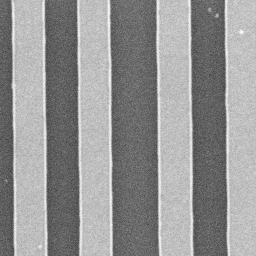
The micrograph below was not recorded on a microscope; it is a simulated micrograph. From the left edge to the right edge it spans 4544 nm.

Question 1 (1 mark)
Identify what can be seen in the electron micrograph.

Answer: groups of lines, slits or small figures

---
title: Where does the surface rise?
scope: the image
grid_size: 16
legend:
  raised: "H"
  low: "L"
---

LHHLLHHLLLHHLLHH
LHHLLHHLLLHHLLHH
LHHLLHHLLLHHLLHH
LHHLLHHLLLHHLLHH
LHHLLHHLLLHHLLHH
LHHLLHHLLLHHLLHH
LHHLLHHLLLHHLLHH
LHHLLHHLLLHHLLHH
LHHLLHHLLLHHLLHH
LHHLLHHLLLHHLLHH
LHHLLHHLLLHHLLHH
LHHLLHHLLLHHLLHH
LHHLLHHLLLHHLLHH
LHHLLHHLLLHHLLHH
LHHLLHHLLLHHLLHH
LHHLLHHLLLHHLLHH